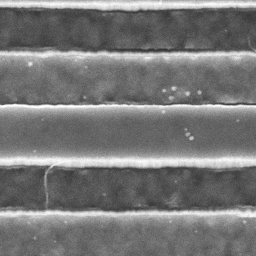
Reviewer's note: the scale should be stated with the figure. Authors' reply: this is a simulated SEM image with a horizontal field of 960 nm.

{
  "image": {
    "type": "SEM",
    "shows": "lines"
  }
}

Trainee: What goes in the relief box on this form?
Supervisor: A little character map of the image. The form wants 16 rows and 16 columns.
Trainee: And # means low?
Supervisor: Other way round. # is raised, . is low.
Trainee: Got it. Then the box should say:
................
................
................
################
################
################
################
################
################
################
................
................
................
################
################
################